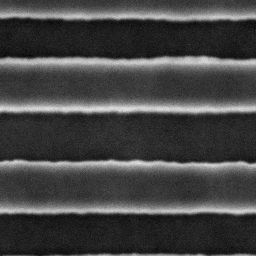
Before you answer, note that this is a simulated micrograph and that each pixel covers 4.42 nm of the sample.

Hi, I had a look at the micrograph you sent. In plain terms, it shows lines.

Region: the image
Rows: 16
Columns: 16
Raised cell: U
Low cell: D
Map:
UUUUUUUUUUUUUUUU
DDDDDDDDDDDDDDDD
DDDDDDDDDDDDDDDD
DDDDDDDDDDDDDDDD
UUUUUUUUUUUUUUUU
UUUUUUUUUUUUUUUU
UUUUUUUUUUUUUUUU
DDDDDDDDDDDDDDDD
DDDDDDDDDDDDDDDD
DDDDDDDDDDDDDDDD
UUUUUUUUUUUUUUUU
UUUUUUUUUUUUUUUU
UUUUUUUUUUUUUUUU
DDDDDDDDDDDDDDDD
DDDDDDDDDDDDDDDD
DDDDDDDDDDDDDDDD